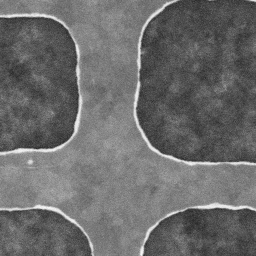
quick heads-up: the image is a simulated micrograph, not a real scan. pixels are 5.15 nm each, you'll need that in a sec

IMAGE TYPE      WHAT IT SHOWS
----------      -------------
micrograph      holes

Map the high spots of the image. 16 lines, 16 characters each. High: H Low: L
HHHHHHHHHHLLLLLL
LLLLHHHHHLLLLLLL
LLLLLHHHHLLLLLLL
LLLLLHHHHLLLLLLL
LLLLLHHHHLLLLLLL
LLLLLHHHHLLLLLLL
LLLLLHHHLLLLLLLL
LLLLLHHHHLLLLLLL
LLLLHHHHHLLLLLLL
LHHHHHHHHHLLLLLL
HHHHHHHHHHHHHHHH
HHHHHHHHHHHHHHHH
HHHHHHHHHHHHHHHH
LLLLHHHHHHHLLLLL
LLLLLHHHHLLLLLLL
LLLLLLHHHLLLLLLL